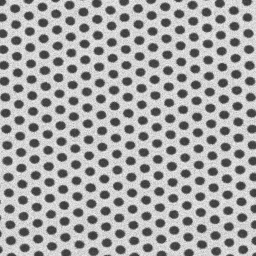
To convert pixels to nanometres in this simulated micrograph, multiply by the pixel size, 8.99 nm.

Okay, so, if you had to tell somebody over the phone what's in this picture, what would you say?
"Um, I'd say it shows a regular array of holes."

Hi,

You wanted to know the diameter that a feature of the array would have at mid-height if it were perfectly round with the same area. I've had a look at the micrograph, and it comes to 87.8 nanometres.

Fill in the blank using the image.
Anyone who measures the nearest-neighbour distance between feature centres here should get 139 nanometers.